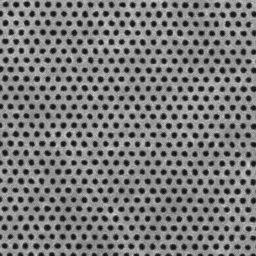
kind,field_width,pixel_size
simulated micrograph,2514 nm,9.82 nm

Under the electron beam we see a regular array of holes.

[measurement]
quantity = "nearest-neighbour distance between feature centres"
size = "100 nm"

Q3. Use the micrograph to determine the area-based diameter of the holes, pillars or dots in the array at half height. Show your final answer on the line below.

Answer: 63.7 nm